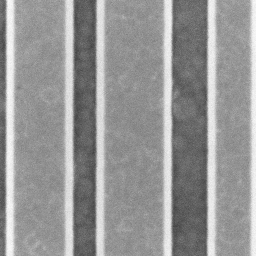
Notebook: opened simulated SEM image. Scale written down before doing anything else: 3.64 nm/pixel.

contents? one or a few lines or trenches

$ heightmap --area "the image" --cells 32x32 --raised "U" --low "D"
DUUUUUUUUDDDDUUUUUUUUDDDDDUUUUUU
DUUUUUUUUDDDDUUUUUUUUDDDDDUUUUUU
DUUUUUUUUDDDDUUUUUUUUDDDDDUUUUUU
DUUUUUUUUDDDDUUUUUUUUDDDDDUUUUUU
DUUUUUUUUDDDDUUUUUUUUDDDDDUUUUUU
DUUUUUUUUDDDDUUUUUUUUDDDDDUUUUUU
DUUUUUUUUDDDDUUUUUUUUDDDDDUUUUUU
DUUUUUUUUDDDDUUUUUUUUDDDDDUUUUUU
DUUUUUUUUDDDDUUUUUUUUDDDDDDUUUUU
DUUUUUUUUDDDDUUUUUUUUDDDDDUUUUUU
DUUUUUUUUDDDDUUUUUUUUDDDDDUUUUUU
DUUUUUUUUDDDDUUUUUUUUDDDDDUUUUUU
DUUUUUUUUDDDDUUUUUUUUDDDDDUUUUUU
DUUUUUUUUDDDDUUUUUUUUDDDDDUUUUUU
DUUUUUUUUDDDDUUUUUUUUDDDDDUUUUUU
DUUUUUUUUDDDDUUUUUUUUDDDDDUUUUUU
DUUUUUUUUDDDDUUUUUUUUDDDDDUUUUUU
DUUUUUUUUDDDDUUUUUUUUDDDDDUUUUUU
DUUUUUUUUDDDDUUUUUUUUDDDDDUUUUUU
DUUUUUUUUDDDDUUUUUUUUDDDDDUUUUUU
DUUUUUUUUDDDDUUUUUUUUDDDDDUUUUUU
DUUUUUUUUDDDDUUUUUUUUDDDDDDUUUUU
DUUUUUUUUDDDDUUUUUUUUDDDDDDUUUUU
DUUUUUUUUDDDDUUUUUUUUDDDDDUUUUUU
DUUUUUUUUDDDDUUUUUUUUDDDDDDUUUUU
DUUUUUUUUDDDDUUUUUUUUDDDDDUUUUUU
DUUUUUUUUDDDDUUUUUUUUDDDDDUUUUUU
DUUUUUUUUDDDDUUUUUUUUDDDDDUUUUUU
DUUUUUUUUDDDDUUUUUUUUDDDDDUUUUUU
DUUUUUUUUDDDDUUUUUUUUDDDDDUUUUUU
DUUUUUUUUDDDDUUUUUUUUDDDDDUUUUUU
DUUUUUUUUDDDDUUUUUUUUDDDDDUUUUUU